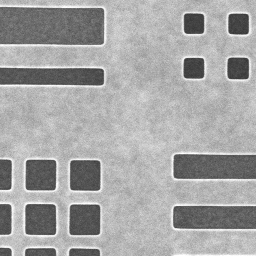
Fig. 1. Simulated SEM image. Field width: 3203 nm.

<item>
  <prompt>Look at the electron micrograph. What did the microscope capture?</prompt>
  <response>groups of lines, slits or small figures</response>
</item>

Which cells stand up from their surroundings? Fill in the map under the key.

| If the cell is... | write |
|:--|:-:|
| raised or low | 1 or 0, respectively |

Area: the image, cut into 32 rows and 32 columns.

11111111111111111111111111111111
00000000000001111111111111111111
00000000000001111111111000111001
00000000000001111111111000111001
00000000000001111111111111111111
00000000000001111111111111111111
11111111111111111111111111111111
11111111111111111111111001111001
00000000000011111111111000110001
00000000000001111111111001110001
00000000000001111111111111111111
11111111111111111111111111111111
11111111111111111111111111111111
11111111111111111111111111111111
11111111111111111111111111111111
11111111111111111111111111111111
11111111111111111111111111111111
11111111111111111111111111111111
11111111111111111111111111111111
11111111111111111111110000000000
01100001100001111111110000000000
00100001100001111111110000000000
00100001100001111111111111111111
01100001100011111111111111111111
11111111111111111111111111111111
01110011100011111111111111111111
00100001100001111111110000000000
01100001100001111111110000000000
01100001100001111111110000000000
11111111111111111111111111111111
11111111111111111111111111111111
01100001100011111111111111111111